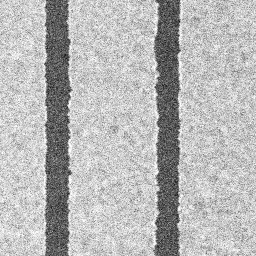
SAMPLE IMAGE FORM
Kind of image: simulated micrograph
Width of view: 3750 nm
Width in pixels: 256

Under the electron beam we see one or a few lines or trenches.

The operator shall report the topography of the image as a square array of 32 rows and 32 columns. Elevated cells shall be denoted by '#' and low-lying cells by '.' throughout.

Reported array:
######...###########...#########
######...###########...#########
######...###########...#########
######...###########...#########
######...##########...##########
######...##########...##########
######...##########....#########
######...##########...##########
######...##########...##########
######...###########...#########
######...##########....#########
######...##########...##########
######...##########...##########
######...##########...##########
######...###########...#########
######...##########....#########
######...###########...#########
######...###########...#########
######...##########....#########
######...###########...#########
######...###########..##########
######...###########..##########
######...##########....#########
######...###########..##########
######...###########..##########
######...###########..##########
######...###########..##########
######...##########...##########
######...##########...##########
######...##########...##########
######...##########...##########
######...##########....#########